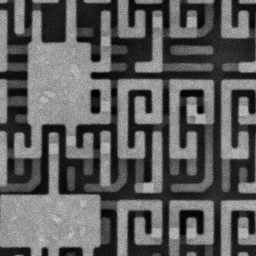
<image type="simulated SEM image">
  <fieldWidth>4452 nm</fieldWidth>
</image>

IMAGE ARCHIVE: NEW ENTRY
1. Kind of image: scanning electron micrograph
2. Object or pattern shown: wiring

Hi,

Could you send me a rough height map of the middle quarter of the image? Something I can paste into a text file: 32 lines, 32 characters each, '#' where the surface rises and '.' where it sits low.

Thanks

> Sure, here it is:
###########.......######........
###########.......######........
#######.........................
#######.........................
###########..###########...#####
###########..###########...#####
#######..##..####.....##...##...
######...##..###......##...##...
######...##..###..##..##...##..#
######...##..###..##..##...##..#
######...##..###..##..##...##..#
#######..##..###..##..##...##..#
#######.###..###..###.##...##..#
############.###..######...##..#
###########..###..######...##..#
###..........###...........##...
.##..........###...........##...
.##..##..##..###..##..##...##..#
.##..##..##..###..##..##...##..#
.##..##..##..###..##..##...##..#
.##..##..##..###..##..##...##..#
.######..##..#######..##...#####
.######..##..#######..##...#####
.######..##...######..##...#####
.........##...........##........
.........##...........##........
.........##...........##........
.........##...........##........
.........##...........##........
.........##...........##........
.........##.......######........
..................######........